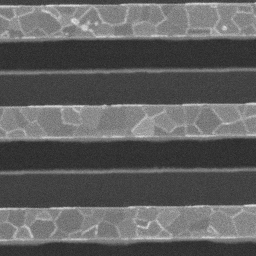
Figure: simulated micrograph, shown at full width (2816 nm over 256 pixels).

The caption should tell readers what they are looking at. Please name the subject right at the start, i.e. lines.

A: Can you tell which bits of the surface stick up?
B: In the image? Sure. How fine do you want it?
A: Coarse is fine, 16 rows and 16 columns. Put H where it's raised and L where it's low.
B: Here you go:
HHHHHHHHHHHHHHHH
HHHHHHHHHHHHHHHH
LLLLLLLLLLLLLLLL
LLLLLLLLLLLLLLLL
LLLLLLLLHHHHHHHH
HHHHHHHHHHHHHHHH
HHHHHHHHHHHHHHHH
HHHHHHHHHHHHHHHH
HHHHHHHHHHHHHHHL
LLLLLLLLLLLLLLLL
LLLLLLLLLLLLLLLL
HHHHHHHHHHHHHHHH
HHHHHHHHHHHHHHHH
HHHHHHHHHHHHHHHH
HHHHHHHHHHHHHHHH
LLLLLLLLLLLLLLLL